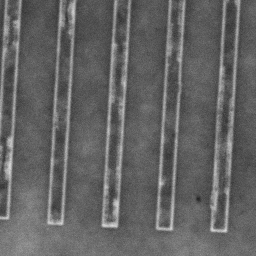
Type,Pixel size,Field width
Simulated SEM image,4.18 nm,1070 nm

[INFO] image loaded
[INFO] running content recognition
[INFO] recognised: parallel lines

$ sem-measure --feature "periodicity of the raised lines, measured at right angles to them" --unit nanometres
228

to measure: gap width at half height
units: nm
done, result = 167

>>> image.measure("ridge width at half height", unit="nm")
60